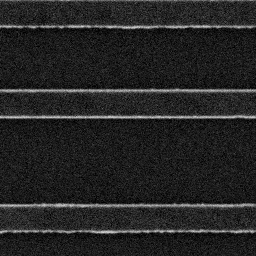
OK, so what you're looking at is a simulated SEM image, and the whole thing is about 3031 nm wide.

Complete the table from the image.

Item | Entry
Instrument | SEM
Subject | lines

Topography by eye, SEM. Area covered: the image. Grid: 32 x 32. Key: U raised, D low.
UUUUUUUUUUUUUUUUUUUUUUUUUUUUUUUU
UUUUUUUUUUUUUUUUUUUUUUUUUUUUUUUU
UUUUUUUUUUUUUUUUUUUUUUUUUUUUUUUU
DDDDDDDDDDDDDDDDDDDDDDDDDDDDDDDD
DDDDDDDDDDDDDDDDDDDDDDDDDDDDDDDD
DDDDDDDDDDDDDDDDDDDDDDDDDDDDDDDD
DDDDDDDDDDDDDDDDDDDDDDDDDDDDDDDD
DDDDDDDDDDDDDDDDDDDDDDDDDDDDDDDD
DDDDDDDDDDDDDDDDDDDDDDDDDDDDDDDD
DDDDDDDDDDDDDDDDDDDDDDDDDDDDDDDD
DDDDDDDDDDDDDDDDDDDDDDDDDDDDDDDD
UUUUUUUUUUUUUUUUUUUUUUUUUUUUUUUU
UUUUUUUUUUUUUUUUUUUUUUUUUUUUUUUU
UUUUUUUUUUUUUUUUUUUUUUUUUUUUUUUU
UUUUUUUUUUUUUUUUUUUUUUUUUUUUUUUU
DDDDDDDDDDDDDDDDDDDDDDDDDDDDDDDD
DDDDDDDDDDDDDDDDDDDDDDDDDDDDDDDD
DDDDDDDDDDDDDDDDDDDDDDDDDDDDDDDD
DDDDDDDDDDDDDDDDDDDDDDDDDDDDDDDD
DDDDDDDDDDDDDDDDDDDDDDDDDDDDDDDD
DDDDDDDDDDDDDDDDDDDDDDDDDDDDDDDD
DDDDDDDDDDDDDDDDDDDDDDDDDDDDDDDD
DDDDDDDDDDDDDDDDDDDDDDDDDDDDDDDD
DDDDDDDDDDDDDDDDDDDDDDDDDDDDDDDD
DDDDDDDDDDDDDDDDDDDDDDDDDDDDDDDD
DDDDDDDDDDDDDDDDDDDDDDDDDDDDDDDD
UUUUUUUUUUUUUUUUUUUUUUUUUUUUUUUU
UUUUUUUUUUUUUUUUUUUUUUUUUUUUUUUU
UUUUUUUUUUUUUUUUUUUUUUUUUUUUUUUU
DDDDDDDDDDDDDDDDDDDDDDDDDDDDDDDD
DDDDDDDDDDDDDDDDDDDDDDDDDDDDDDDD
DDDDDDDDDDDDDDDDDDDDDDDDDDDDDDDD